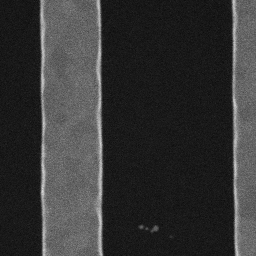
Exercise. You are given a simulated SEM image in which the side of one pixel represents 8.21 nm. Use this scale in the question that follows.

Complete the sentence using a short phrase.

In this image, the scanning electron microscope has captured wiring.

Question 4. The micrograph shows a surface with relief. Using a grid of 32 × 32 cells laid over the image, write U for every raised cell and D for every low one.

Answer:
DDDDDUUUUUUUDDDDDDDDDDDDDDDDDUUU
DDDDDUUUUUUUDDDDDDDDDDDDDDDDDUUU
DDDDDUUUUUUUUDDDDDDDDDDDDDDDDUUU
DDDDDUUUUUUUUDDDDDDDDDDDDDDDDUUU
DDDDDUUUUUUUUDDDDDDDDDDDDDDDDUUU
DDDDDUUUUUUUUDDDDDDDDDDDDDDDDUUU
DDDDDUUUUUUUUDDDDDDDDDDDDDDDDUUU
DDDDDUUUUUUUDDDDDDDDDDDDDDDDDUUU
DDDDDUUUUUUUDDDDDDDDDDDDDDDDDUUU
DDDDDUUUUUUUDDDDDDDDDDDDDDDDDUUU
DDDDDUUUUUUUUDDDDDDDDDDDDDDDDUUU
DDDDDUUUUUUUUDDDDDDDDDDDDDDDDUUU
DDDDDUUUUUUUUDDDDDDDDDDDDDDDDUUU
DDDDDUUUUUUUUDDDDDDDDDDDDDDDDUUU
DDDDDUUUUUUUDDDDDDDDDDDDDDDDDUUU
DDDDDUUUUUUUDDDDDDDDDDDDDDDDDUUU
DDDDDUUUUUUUUDDDDDDDDDDDDDDDDUUU
DDDDDUUUUUUUUDDDDDDDDDDDDDDDDUUU
DDDDDUUUUUUUUDDDDDDDDDDDDDDDDUUU
DDDDDUUUUUUUUDDDDDDDDDDDDDDDDUUU
DDDDDUUUUUUUUDDDDDDDDDDDDDDDDUUU
DDDDDUUUUUUUUDDDDDDDDDDDDDDDDUUU
DDDDDUUUUUUUUDDDDDDDDDDDDDDDDUUU
DDDDDUUUUUUUUDDDDDDDDDDDDDDDDUUU
DDDDDUUUUUUUUDDDDDDDDDDDDDDDDUUU
DDDDDUUUUUUUDDDDDDDDDDDDDDDDDUUU
DDDDDUUUUUUUUDDDDDDDDDDDDDDDDDUU
DDDDDDUUUUUUUDDDDDDDDDDDDDDDDUUU
DDDDDDUUUUUUUDDDDDDDDDDDDDDDDUUU
DDDDDUUUUUUUUDDDDDDDDDDDDDDDDUUU
DDDDDUUUUUUUUDDDDDDDDDDDDDDDDUUU
DDDDDUUUUUUUUDDDDDDDDDDDDDDDDDUU